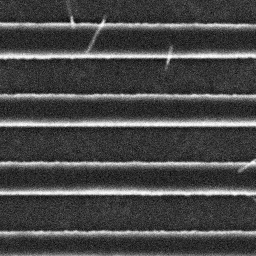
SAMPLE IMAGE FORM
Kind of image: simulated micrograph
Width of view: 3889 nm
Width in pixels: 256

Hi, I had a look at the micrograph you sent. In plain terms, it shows lines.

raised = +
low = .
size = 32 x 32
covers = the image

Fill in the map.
................................
................................
................................
++++++++++++++++++++++++++++++++
++++++++++++++++++++++++++++++++
++++++++++++++++++++++++++++++++
++++++++++++++++++++++++++++++++
................................
................................
................................
................................
................................
++++++++++++++++++++++++++++++++
++++++++++++++++++++++++++++++++
++++++++++++++++++++++++++++++++
++++++++++++++++++++++++++++++++
................................
................................
................................
................................
++++++++++++++++++++++++++++++++
++++++++++++++++++++++++++++++++
++++++++++++++++++++++++++++++++
++++++++++++++++++++++++++++++++
................................
................................
................................
................................
................................
++++++++++++++++++++++++++++++++
++++++++++++++++++++++++++++++++
++++++++++++++++++++++++++++++++